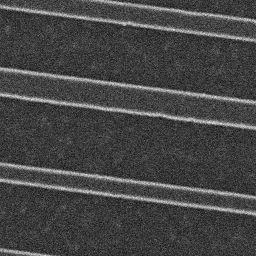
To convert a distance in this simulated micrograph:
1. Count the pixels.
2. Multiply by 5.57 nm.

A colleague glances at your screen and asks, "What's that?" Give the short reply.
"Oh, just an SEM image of one or a few lines or trenches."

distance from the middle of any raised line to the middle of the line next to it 490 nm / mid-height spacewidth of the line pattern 378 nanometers